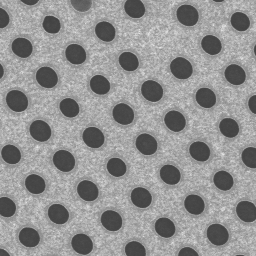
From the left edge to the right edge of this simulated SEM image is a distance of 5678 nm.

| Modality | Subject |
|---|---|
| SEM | a regular array of holes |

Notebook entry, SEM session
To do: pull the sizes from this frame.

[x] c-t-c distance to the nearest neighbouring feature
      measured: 824 nm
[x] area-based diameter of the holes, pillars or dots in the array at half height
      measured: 462 nm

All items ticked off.